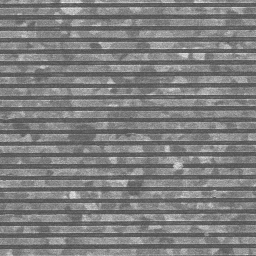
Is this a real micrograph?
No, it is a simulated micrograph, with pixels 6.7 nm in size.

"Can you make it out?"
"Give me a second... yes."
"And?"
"parallel lines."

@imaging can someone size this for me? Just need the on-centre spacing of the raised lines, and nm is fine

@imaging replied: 77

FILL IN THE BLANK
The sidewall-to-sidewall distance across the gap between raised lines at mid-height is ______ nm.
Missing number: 33.5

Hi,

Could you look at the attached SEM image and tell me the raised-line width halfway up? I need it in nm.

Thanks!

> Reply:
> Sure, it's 42.7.